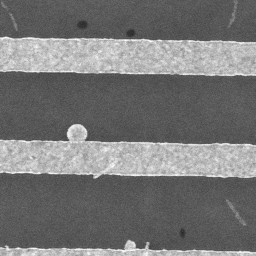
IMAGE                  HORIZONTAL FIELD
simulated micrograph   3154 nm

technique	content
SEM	lines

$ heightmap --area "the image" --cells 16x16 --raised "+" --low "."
................
................
+++++++.+.......
++++++++++++++++
....++++++++++++
................
................
................
................
++++++++++++++++
++++++++++++++++
................
................
................
................
................